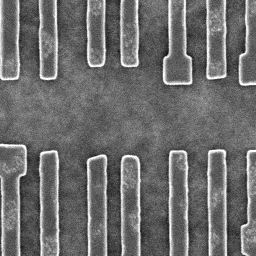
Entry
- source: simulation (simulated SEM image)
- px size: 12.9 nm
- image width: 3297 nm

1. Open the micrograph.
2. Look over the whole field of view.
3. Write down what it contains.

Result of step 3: wiring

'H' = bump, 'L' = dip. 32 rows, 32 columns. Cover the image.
HHLLLHHLLLLHHLLHHLLLLHHLLLHHLLLH
HHLLLHHLLLLHHLLHHLLLLHHLLLHHLLLH
HHLLLHHLLLLHHLLHHLLLLHHLLLHHLLLH
HHLLLHHLLLLHHLLHHLLLLHHLLLHHLLLH
HHLLLHHLLLLHHLLHHLLLLHHLLLHHLLLH
HHLLLHHLLLLHHLLHHLLLLHHLLLHHLLLH
HHLLLHHLLLLHHLLHHLLLLHHLLLHHLLLH
HHLLLHHLLLLHHLLHHLLLLHHHLLHHLLHH
HHLLLHHLLLLLLLLLLLLLLHHHLLHHLLHH
HHLLLHHLLLLLLLLLLLLLLHHHLLHHLLHH
LLLLLLLLLLLLLLLLLLLLLLLLLLLLLLHH
LLLLLLLLLLLLLLLLLLLLLLLLLLLLLLLL
LLLLLLLLLLLLLLLLLLLLLLLLLLLLLLLL
LLLLLLLLLLLLLLLLLLLLLLLLLLLLLLLL
LLLLLLLLLLLLLLLLLLLLLLLLLLLLLLLL
LLLLLLLLLLLLLLLLLLLLLLLLLLLLLLLL
LLLLLLLLLLLLLLLLLLLLLLLLLLLLLLLL
LLLLLLLLLLLLLLLLLLLLLLLLLLLLLLLL
HHHLLLLLLLLLLLLLLLLLLLLLLLLLLLLL
HHHLLHHLLLLLHLLLHLLLLHHLLLHHLLLH
HHHLLHHLLLLHHLLHHLLLLHHLLLHHLLLH
HHHLLHHLLLLHHLLHHLLLLHHLLLHHLLLH
HHLLLHHLLLLHHLLHHLLLLHHLLLHHLLLH
HHLLLHHLLLLHHLLHHLLLLHHLLLHHLLLH
HHLLLHHLLLLHHLLHHLLLLHHLLLHHLLLH
HHLLLHHLLLLHHLLHHLLLLHHLLLHHLLLH
HHLLLHHLLLLHHLLHHLLLLHHLLLHHLLLH
HHLLLHHLLLLHHLLHHLLLLHHLLLHHLLLH
HHLLLHHLLLLHHLLHHLLLLHHLLLHHLLHH
HHLLLHHLLLLHHLLHHLLLLHHLLLHHLLHH
HHLLLHHLLLLHHLLHHLLLLHHLLLHHLLHH
HHLLLHHLLLLHHLLHHLLLLHHLLLHHLLHH